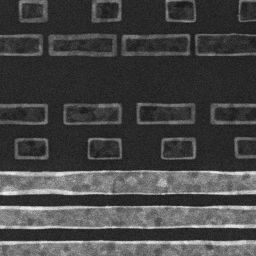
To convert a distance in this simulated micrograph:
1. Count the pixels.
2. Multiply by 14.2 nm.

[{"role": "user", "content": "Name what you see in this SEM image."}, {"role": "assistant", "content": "wiring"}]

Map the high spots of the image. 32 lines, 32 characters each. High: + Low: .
...+++......+++......+++......++
...+++......+++......+++......++
...++.......++.......+++......++
................................
......................+..+++++++
+++++.++++++++..++++++++.+++++++
+++++..+++++++..+++++++..+++++++
................................
................................
................................
................................
................................
................................
++++++..+++++++..+++++++...+++++
++++++..+++++++..+++++++...+++++
................................
................................
...+++.....+++.......+++......++
..++++.....++++.....++++......++
..++++.....++++.....++++......++
................................
...........++++++++++++++++.....
++++++++++++++++++++++++++++++++
++++++++++++++++++++++++++++++++
................................
................................
++++++++++++++++++++++++++++++++
++++++++++++++++++++++++++++++++
..........+++...................
................................
++++++++++++++++++++++++++++++++
++++++++++++++++++++++++++++++++